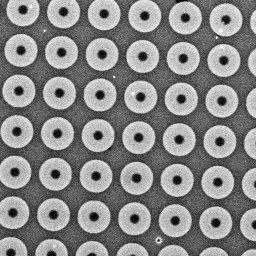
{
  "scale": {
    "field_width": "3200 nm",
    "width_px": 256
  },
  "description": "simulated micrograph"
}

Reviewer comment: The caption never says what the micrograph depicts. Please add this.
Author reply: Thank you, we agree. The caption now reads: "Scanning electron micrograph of an array of small figures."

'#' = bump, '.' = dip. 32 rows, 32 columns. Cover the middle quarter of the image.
##.....#####....#######...######
........##........####.....#####
.............................##.
................................
##.....####.......###...........
##....######....######.....#####
###..########...#######...######
###..########..########..#######
###..########..########..#######
##...########..########..#######
#.....######....#######...######
........##.......#####....######
............................###.
................................
#.....#####.......#.............
##...#######....#####......####.
##...#######...#######....######
##...#######...########..#######
##...#######...########..#######
##...#######...########..#######
#....#######...#######...#######
.......###......#####.....######
...........................####.
................................
#.....####......................
#....######....######.....####..
##..########...#######...######.
##..########..########...#######
##..########..########..########
#...########..########..########
#....######....#######..########
......####.....######....#######